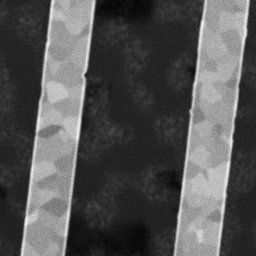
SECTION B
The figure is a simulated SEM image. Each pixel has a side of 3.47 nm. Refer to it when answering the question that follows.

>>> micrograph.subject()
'one or a few lines or trenches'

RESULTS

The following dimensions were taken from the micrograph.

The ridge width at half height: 0.143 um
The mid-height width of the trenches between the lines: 384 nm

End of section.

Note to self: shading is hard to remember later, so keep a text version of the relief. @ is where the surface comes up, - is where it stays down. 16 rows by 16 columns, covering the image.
---@@@-------@@-
---@@@-------@@-
---@@@-------@@-
---@@-------@@@-
---@@-------@@@-
---@@-------@@@-
---@@-------@@@-
--@@@-------@@@-
--@@@-------@@--
--@@@-------@@--
--@@@-------@@--
--@@-------@@@--
--@@-------@@@--
--@@-------@@@--
--@@-------@@@--
-@@@-------@@@--